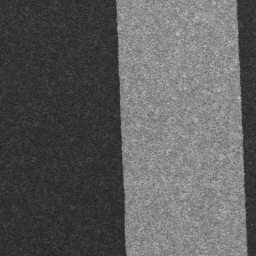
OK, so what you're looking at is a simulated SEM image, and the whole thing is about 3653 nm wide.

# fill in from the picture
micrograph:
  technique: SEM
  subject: one or a few lines or trenches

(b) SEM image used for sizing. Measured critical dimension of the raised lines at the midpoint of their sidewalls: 120 px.